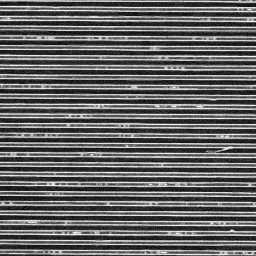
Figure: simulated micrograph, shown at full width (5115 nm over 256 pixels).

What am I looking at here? parallel lines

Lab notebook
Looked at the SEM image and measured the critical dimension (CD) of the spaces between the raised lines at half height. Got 117 nanometres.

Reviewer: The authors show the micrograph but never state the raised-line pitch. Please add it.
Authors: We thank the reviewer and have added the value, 194 nm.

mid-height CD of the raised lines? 84.9 nm